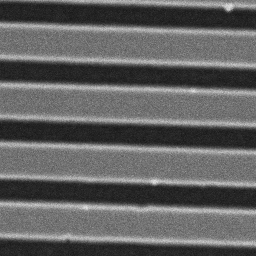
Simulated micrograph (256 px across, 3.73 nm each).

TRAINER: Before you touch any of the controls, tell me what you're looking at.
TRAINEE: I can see parallel lines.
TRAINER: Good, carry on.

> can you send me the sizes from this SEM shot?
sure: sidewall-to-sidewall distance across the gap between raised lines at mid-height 81.6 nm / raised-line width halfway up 142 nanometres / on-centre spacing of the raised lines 222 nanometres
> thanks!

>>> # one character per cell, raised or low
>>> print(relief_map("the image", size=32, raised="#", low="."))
..............##################
................................
................................
###################..#..........
################################
################################
################################
..##############################
.............................###
................................
#######.##......................
################################
################################
################################
################################
.................###############
................................
................................
########################........
################################
################################
################################
.....###########################
................................
................................
############....................
################################
################################
################################
################################
....................############
................................